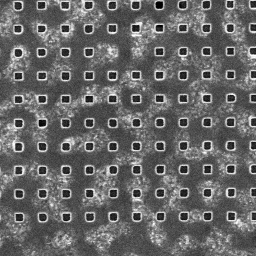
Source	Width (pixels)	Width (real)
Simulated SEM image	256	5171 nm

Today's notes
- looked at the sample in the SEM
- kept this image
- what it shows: a regular array of holes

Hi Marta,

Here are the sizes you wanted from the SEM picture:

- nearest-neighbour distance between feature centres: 466 nm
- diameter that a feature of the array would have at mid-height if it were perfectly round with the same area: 170 nanometers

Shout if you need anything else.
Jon